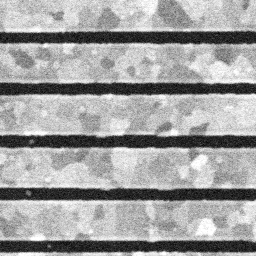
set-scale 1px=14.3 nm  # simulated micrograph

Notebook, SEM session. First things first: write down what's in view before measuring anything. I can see lines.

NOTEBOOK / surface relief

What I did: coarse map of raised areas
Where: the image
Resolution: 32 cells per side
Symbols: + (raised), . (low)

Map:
++++++++++++++++++++++++++++++++
++++++++++++++++++++++++++++++++
++++++++++++++++++++++++++++++++
++++++++++++++++++++++++++++++++
................................
................................
++++++++++++++++++++++++++++++++
++++++++++++++++++++++++++++++++
++++++++++++++++++++++++++++++++
++++++++++++++++++++++++++++++++
................................
................................
++++++++++++++++++++++++++++++++
++++++++++++++++++++++++++++++++
++++++++++++++++++++++++++++++++
++++++++++++++++++++++++++++++++
++++++++++++++++++++++++++++++++
................................
................................
++++++++++++++++++++++++++++++++
++++++++++++++++++++++++++++++++
++++++++++++++++++++++++++++++++
++++++++++++++++++++++++++++++++
................................
................................
++++++++++++++++++++++++++++++++
++++++++++++++++++++++++++++++++
++++++++++++++++++++++++++++++++
++++++++++++++++++++++++++++++++
++++++++++++++++++++++++++++++++
................................
................................